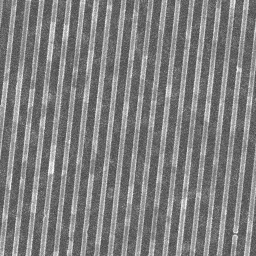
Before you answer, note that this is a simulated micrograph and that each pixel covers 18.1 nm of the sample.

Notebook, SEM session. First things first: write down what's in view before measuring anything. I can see parallel lines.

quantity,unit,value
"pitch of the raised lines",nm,246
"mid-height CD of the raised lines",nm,74.3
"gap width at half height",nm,164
